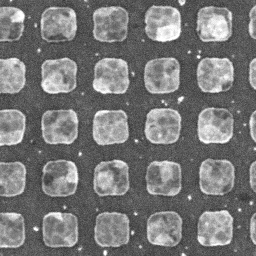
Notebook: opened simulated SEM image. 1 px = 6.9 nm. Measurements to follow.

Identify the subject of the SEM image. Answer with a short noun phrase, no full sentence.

a regular array of raised bodies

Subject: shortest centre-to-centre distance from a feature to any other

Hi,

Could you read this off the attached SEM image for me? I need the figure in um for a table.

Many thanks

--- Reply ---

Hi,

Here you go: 0.351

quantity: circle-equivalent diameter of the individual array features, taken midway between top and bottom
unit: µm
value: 0.247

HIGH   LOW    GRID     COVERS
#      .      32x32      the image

................................
###...###...####...###...####..#
###..####...####..####...####..#
###..####...####..####...####..#
###..####...####...###...####...
................................
................................
##......#.....#....###...###....
###..####...####..####...####..#
###..####...####..####...####..#
###...###...####..####...####..#
##....#......##...........#.....
................................
................................
###..####...####....##...####...
###..#####..####....###...###..#
#.#..#####..####..####...####..#
##....###...####...###...###....
................................
................................
###...###....##....###...####...
###..#####..####..####...####..#
###..####...####..#####..####..#
###..####...####..####...####...
................................
................................
.....................#..........
###...####..####...####..####..#
###...####..####...####..####..#
###...####..####...####..####..#
###...###....##.....##...###....
................................